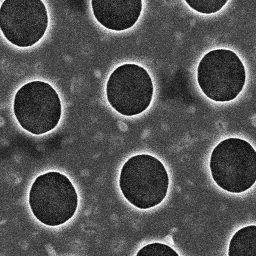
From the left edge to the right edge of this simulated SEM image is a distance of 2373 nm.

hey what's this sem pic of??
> holes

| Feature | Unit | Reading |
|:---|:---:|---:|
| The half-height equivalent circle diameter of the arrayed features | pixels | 50.8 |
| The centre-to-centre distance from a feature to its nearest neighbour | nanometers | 859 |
